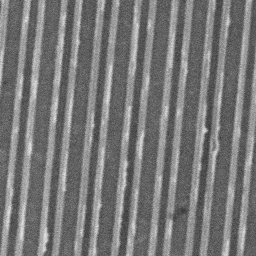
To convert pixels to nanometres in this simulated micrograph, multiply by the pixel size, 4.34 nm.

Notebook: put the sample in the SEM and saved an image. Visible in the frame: parallel lines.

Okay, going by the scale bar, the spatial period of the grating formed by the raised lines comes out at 79.3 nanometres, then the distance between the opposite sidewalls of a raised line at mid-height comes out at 25.4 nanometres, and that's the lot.